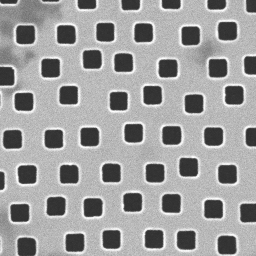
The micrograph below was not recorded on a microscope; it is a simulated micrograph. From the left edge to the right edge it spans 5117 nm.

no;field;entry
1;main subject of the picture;a regular array of holes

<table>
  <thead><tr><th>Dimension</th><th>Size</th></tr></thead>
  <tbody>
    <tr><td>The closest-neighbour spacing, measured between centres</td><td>0.72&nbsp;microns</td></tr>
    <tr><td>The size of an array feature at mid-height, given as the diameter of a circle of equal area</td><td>424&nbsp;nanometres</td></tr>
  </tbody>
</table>